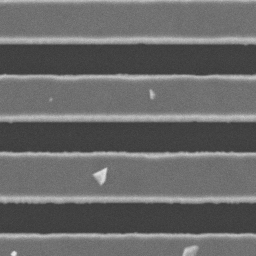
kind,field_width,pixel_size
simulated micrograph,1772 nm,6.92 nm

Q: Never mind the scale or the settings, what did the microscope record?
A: lines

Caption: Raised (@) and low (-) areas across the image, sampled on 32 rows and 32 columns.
@@@@@@@@@@@@@@@@@@@@@@@@@@@@@@@@
@@@@@@@@@@@@@@@@@@@@@@@@@@@@@@@@
@@@@@@@@@@@@@@@@@@@@@@@@@@@@@@@@
@@@@@@@@@@@@@@@@@@@@@@@@@@@@@@@@
@@@@@@@@@@@@@@@@@@@@@@@@@@@@@@@@
--------------------------------
--------------------------------
--------------------------------
--------------------------------
@@@@@@@---@@@@@@@@@@@@@@--@@@@@@
@@@@@@@@@@@@@@@@@@@@@@@@@@@@@@@@
@@@@@@@@@@@@@@@@@@@@@@@@@@@@@@@@
@@@@@@@@@@@@@@@@@@@@@@@@@@@@@@@@
@@@@@@@@@@@@@@@@@@@@@@@@@@@@@@@@
@@@@@@@@@@@@@@@@@@@@@@@@@@@@@@@@
--------------------------------
--------------------------------
--------------------------------
--------------------------------
@@@@@@@@@@@@@@@@@@@@@@@@@@@@@@@@
@@@@@@@@@@@@@@@@@@@@@@@@@@@@@@@@
@@@@@@@@@@@@@@@@@@@@@@@@@@@@@@@@
@@@@@@@@@@@@@@@@@@@@@@@@@@@@@@@@
@@@@@@@@@@@@@@@@@@@@@@@@@@@@@@@@
@@@@@@@@@@@@@@@@@@@@@@@@@@@@@@@@
--------------------------------
--------------------------------
--------------------------------
--------------------------------
@@@@@@@@@@@@@@@@@@@@@@@@@@@@@@@@
@@@@@@@@@@@@@@@@@@@@@@@@@@@@@@@@
@@@@@@@@@@@@@@@@@@@@@@@@@@@@@@@@